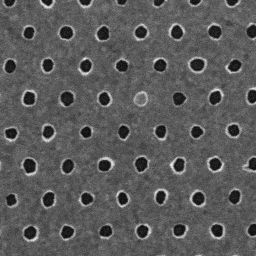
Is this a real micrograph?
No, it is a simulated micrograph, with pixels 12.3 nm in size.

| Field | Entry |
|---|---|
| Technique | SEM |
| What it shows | a regular array of holes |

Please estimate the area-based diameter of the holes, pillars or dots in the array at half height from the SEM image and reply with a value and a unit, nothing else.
161 nm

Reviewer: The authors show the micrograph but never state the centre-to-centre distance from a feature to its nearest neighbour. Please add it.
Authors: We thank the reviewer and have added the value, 451 nm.